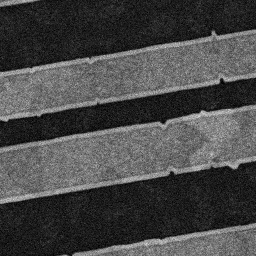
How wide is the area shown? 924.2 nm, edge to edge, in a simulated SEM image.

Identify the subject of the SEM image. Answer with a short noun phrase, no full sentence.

one or a few lines or trenches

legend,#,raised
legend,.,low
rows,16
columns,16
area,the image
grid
................
................
.............###
.......#########
.###############
###########.....
#####...........
...........#####
.....###########
################
############....
######..........
#...............
................
.............###
.......#########